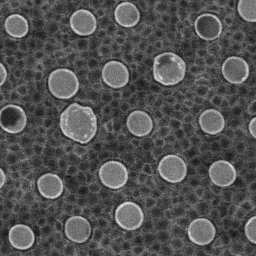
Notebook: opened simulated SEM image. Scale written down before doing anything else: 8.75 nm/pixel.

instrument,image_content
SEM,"a regular array of raised bodies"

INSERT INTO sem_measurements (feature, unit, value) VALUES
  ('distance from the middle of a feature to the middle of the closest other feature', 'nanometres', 451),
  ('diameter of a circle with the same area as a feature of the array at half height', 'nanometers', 228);